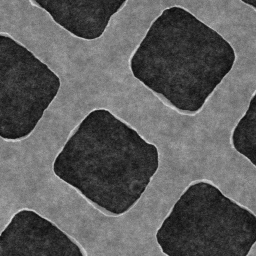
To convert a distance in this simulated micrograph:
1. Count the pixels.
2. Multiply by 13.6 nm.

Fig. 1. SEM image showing holes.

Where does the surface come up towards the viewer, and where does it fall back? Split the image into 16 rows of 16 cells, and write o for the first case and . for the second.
ooo....ooooooooo
oooo...ooo...ooo
.oooooooo.....oo
..oooooo.......o
...ooooo......oo
....ooooo....ooo
...oooooooo..ooo
..ooo..oooooooo.
..oo.....oooooo.
oooo......ooooo.
ooo.......oooooo
oooo.....ooo.ooo
oooooo...oo...oo
o..oooooooo.....
....oooooo......
.....ooooo......